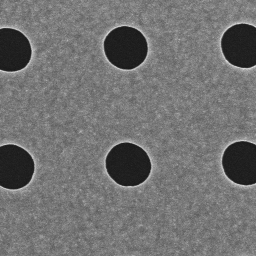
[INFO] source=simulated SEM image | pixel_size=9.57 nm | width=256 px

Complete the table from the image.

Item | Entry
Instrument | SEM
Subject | holes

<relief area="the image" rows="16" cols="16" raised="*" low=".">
****************
****************
..*****..*****..
..*****..*****..
****************
****************
****************
****************
****************
..*****..*****..
..*****..*****..
..*****..******.
****************
****************
****************
****************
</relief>